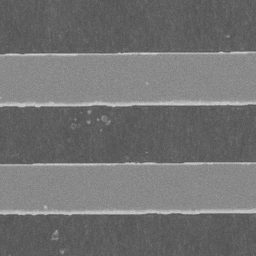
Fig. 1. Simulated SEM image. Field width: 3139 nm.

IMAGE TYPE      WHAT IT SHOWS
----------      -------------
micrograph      lines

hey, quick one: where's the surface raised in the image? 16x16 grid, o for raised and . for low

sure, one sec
................
................
................
oooooooooooooooo
oooooooooooooooo
oooooooooooooooo
ooooooooooo.oo..
................
................
................
oooooooooooooooo
oooooooooooooooo
oooooooooooooooo
................
................
................